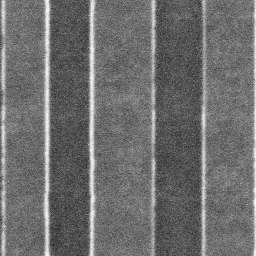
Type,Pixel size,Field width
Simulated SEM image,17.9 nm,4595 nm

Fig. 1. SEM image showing lines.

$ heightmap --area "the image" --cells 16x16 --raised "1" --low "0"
1110001111000111
1110001111000111
1110001111000111
1110001111000111
1110001111000111
1110001111000111
1110001111000111
1110001111000111
1110001111000111
1110001111000111
1110001111000111
1110001111000111
1110001111000111
1110001111000111
1110001111000111
1110001111000111